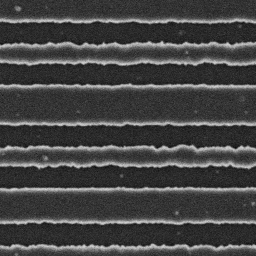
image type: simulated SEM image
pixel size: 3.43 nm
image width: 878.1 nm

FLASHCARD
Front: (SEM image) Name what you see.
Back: lines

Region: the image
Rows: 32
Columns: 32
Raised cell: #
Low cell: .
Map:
################################
################################
################################
................................
................................
..#...###.....#.#####..#.####.##
################################
################################
................................
................................
................................
################################
################################
################################
################################
################################
................................
................................
.##################.#.###.###.#.
################################
################################
................................
................................
..............##..#..####.......
################################
################################
################################
################################
................................
................................
................................
################################